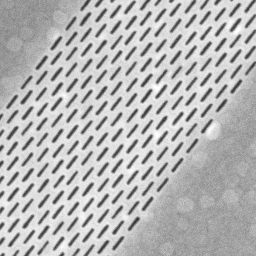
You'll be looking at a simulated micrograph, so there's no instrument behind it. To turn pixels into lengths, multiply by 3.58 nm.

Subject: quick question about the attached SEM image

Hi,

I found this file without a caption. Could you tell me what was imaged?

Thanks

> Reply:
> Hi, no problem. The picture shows a regular array of holes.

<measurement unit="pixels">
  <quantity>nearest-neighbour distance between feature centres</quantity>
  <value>14.8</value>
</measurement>